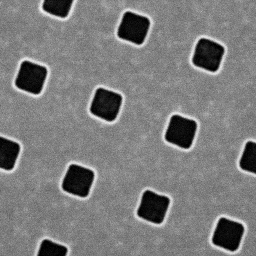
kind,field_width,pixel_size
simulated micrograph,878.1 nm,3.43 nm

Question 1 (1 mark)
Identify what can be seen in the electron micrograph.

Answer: a regular array of holes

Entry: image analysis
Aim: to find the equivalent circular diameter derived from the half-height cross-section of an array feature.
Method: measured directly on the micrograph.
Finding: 112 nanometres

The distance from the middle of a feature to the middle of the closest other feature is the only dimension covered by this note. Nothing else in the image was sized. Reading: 273 nanometres